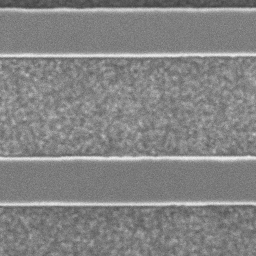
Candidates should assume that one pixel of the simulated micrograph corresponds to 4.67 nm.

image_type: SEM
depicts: lines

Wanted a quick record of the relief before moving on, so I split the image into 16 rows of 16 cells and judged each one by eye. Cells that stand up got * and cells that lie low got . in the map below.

................
****************
****************
*************.*.
................
................
................
................
................
................
****************
****************
****************
................
................
................